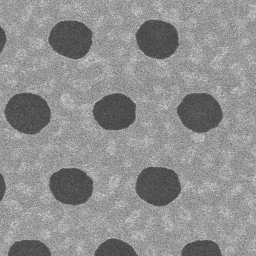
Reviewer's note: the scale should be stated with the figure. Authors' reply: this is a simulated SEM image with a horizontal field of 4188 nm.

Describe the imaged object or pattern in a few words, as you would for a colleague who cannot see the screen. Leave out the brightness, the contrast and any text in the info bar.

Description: holes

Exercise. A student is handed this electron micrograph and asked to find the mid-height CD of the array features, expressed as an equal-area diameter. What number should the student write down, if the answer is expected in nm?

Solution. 682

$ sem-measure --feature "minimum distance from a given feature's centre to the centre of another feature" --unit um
1.38